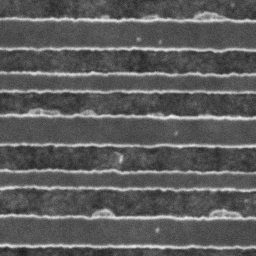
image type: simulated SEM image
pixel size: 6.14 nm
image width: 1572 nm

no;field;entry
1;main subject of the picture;lines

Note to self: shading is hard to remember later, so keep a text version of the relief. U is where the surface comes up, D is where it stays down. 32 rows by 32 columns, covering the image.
DDDDDDDDDDDDDDDDDDDDDDDDDDDDDDDD
DDDDDDDDDDDDDDDDDDDDDDDDDDDDDDDD
UUUUUUUUUUUUUDUUUUDUUUDUDDUUUDDD
UUUUUUUUUUUUUUUUUUUUUUUUUUUUUUUU
UUUUUUUUUUUUUUUUUUUUUUUUUUUUUUUU
UUUUUUUUUUUUUUUUUUUUUUUUUUUUUUUU
DDDDDDDDDDDDDDDDDDDDDDDDDDDDDDDD
DDDDDDDDDDDDDDDDDDDDDDDDDDDDDDDD
DDDDDDDDDDDDDDDDDDDDDDDDDDDDDDDD
UUUUUUUUUUUUUUUUUUUUUUUUUUUUUUUU
UUUUUUUUUUUUUUUUUUUUUUUUUUUUUUUU
UUUUUUUUUUUUUUDUUUUUUUUUUUUUUUUU
DDDDDDDDDDDDDDDDDDDDDDDDDDDDDDDD
DDDDDDDDDDDDDDDDDDDDDDDDDDDDDDDD
UUUUUUDUDUUUDUUUDDDDDDDDDDDDDDDD
UUUUUUUUUUUUUUUUUUUUUUUUUUUUUUUU
UUUUUUUUUUUUUUUUUUUUUUUUUUUUUUUU
UUUUUUUUUUUUUUUUUUUUUUUUUUUUUUUU
DDDDDDDDDDDDDDDDDDDDDDDDDDDDDDDD
DDDDDDDDDDDDDDDDDDDDDDDDDDDDDDDD
DDDDDDDDDDDDDDDDDDDDDDDDDDDDDDDD
UUUUUUUUUUUUUUUDDUUUUUUUDDUDUDDD
UUUUUUUUUUUUUUUUUUUUUUUUUUUUUUUU
UUDDDUUUUUUUUUUUUUUUUUUUUUUUUUUU
DDDDDDDDDDDDDDDDDDDDDDDDDDDDDDDD
DDDDDDDDDDDDDDDDDDDDDDDDDDDDDDDD
DDDDDDDDDDDDDDDDDDDDDDDDDDDDDDDD
UUUUUUUUUUUUUUUUUUUUUUUUUUUUUUUU
UUUUUUUUUUUUUUUUUUUUUUUUUUUUUUUU
UUUUUUUUUUUUUUUUUUUUUUUUUUUUUUUU
UUUUUUUUUUUUUUUUUUUUUUUUUUUUUUUU
DDDDDDDDDDDDDDDDDDDDDDDDDDDDDDDD